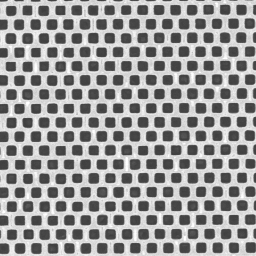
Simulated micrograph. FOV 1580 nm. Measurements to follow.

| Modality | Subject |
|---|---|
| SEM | a regular array of holes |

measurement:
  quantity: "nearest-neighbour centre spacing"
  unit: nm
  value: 97.5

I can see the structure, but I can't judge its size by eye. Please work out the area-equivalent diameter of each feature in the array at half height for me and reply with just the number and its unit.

71.7 nm